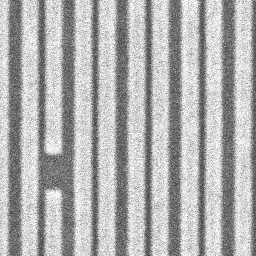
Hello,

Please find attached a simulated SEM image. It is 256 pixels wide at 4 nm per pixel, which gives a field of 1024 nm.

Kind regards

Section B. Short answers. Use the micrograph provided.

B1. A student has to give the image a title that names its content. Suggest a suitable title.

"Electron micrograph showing parallel lines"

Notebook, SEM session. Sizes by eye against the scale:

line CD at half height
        63.4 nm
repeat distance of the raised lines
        107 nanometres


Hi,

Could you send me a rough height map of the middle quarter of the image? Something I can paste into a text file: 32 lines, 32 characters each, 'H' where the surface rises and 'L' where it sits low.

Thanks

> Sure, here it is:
LLLHHHHLLHHHHLLLHHHHLLHHHHLLLLHH
LLLHHHHLLHHHHLLLHHHHLLHHHHLLLLHH
LLLHHHHLLHHHHLLLHHHHLLHHHHLLLLHH
LLLHHHHLLHHHHLLLHHHHLLHHHHLLLHHH
LLLHHHHLLHHHHLLLHHHHLLHHHHLLLLHH
LLLHHHHLLHHHHLLLHHHHLLHHHHLLLLHH
LLLHHHHLLHHHHLLLHHHHLLHHHHLLLLHH
LLLHHHHLLHHHHLLLHHHHLLHHHHLLLLHH
LLLHHHHLLHHHHLLLHHHHLLHHHHLLLLHH
LLLHHHHLLHHHHLLLHHHHLLHHHHLLLLHH
LLLHHHHLLHHHHLLLHHHHLLHHHHLLLLHH
LLLHHHHLLHHHHLLLHHHHLLHHHHLLLLHH
LLLHHHHLLHHHHLLLHHHHLLHHHHLLLLHH
LLLHHHHLLHHHHLLLHHHHLLHHHHLLLLHH
LLLHHHHLLHHHHLLLHHHHLLHHHHLLLLHH
LLLHHHHLLHHHHLLLHHHHLLHHHHLLLLHH
LLLHHHHLLHHHHLLLHHHHLLHHHHLLLLHH
LLLHHHHLLHHHHLLLHHHHLLHHHHLLLLHH
LLLHHHHLLHHHHLLLHHHHLLHHHHLLLLHH
LLLHHHHLLHHHHLLLHHHHLLHHHHLLLLHH
LLLHHHHLLHHHHLLLHHHHLLHHHHLLLLHH
LLLHHHHLLHHHHLLLHHHHLLHHHHLLLLHH
LLLHHHHLLHHHHLLLHHHHLLHHHHLLLLHH
LLLHHHHLLHHHHLLLHHHHLLHHHHLLLHHH
LLLHHHHLLHHHHLLLHHHHLLHHHHLLLHHH
LLLHHHHLLHHHHLLLHHHHLLHHHHLLLHHH
LLLHHHHLLHHHHLLLHHHHLLHHHHLLLHHH
LLLHHHHLLHHHHLLLHHHHLLHHHHLLLHHH
LLLHHHHLLHHHHLLLHHHHLLHHHHLLLHHH
LLLHHHHLLHHHHLLLHHHHLLHHHHLLLHHH
LLLHHHHLLHHHHLLLHHHHLLHHHHLLLHHH
LLLHHHHLLHHHHLLLHHHHLLHHHHLLLHHH